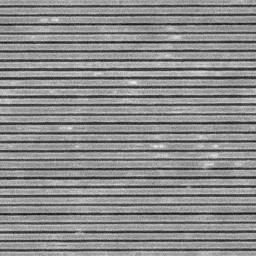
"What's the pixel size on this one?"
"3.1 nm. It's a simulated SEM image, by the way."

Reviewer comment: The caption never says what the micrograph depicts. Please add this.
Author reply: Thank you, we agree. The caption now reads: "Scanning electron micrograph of parallel lines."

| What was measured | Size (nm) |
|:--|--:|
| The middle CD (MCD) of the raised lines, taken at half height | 17.8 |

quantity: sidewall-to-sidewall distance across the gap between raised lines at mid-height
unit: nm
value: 8.9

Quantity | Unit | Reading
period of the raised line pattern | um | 0.028